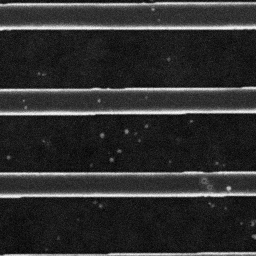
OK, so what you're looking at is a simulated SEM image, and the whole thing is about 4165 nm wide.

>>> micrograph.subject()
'lines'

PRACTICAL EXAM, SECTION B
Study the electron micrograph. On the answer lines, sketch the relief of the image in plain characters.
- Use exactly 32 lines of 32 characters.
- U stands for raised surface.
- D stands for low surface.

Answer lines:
DUUUUUUUUUUUUUUUUUUUUUUUUUUUUUUU
UUUUUUUUUUUUUUUUUUUUUUUUUUUUUUUU
UUUUUUUUUUUUUUUUUUUUUUUUUUUUUUUU
UUUUUUUUUUUUUUUUUUUUUUUUUUUUUDDD
DDDDDDDDDDDDDDDDDDDDDDDDDDDDDDDD
DDDDDDDDDDDDDDDDDDDDDDDDDDDDDDDD
DDDDDDDDDDDDDDDDDDDDDDDDDDDDDDDD
DDDDDDDDDDDDDDDDDDDDDDDDDDDDDDDD
DDDDDDDDDDDDDDDDDDDDDDDDDDDDDDDD
DDDDDDDDDDDDDDDDDDDDDDDDDDDDDDDD
DDDDDDDDDDDDDDDDDDDDDDDDDDDDDDDD
UUUUUUUUUUUUUUUUUUUUUUUUUUUUUUUU
UUUUUUUUUUUUUUUUUUUUUUUUUUUUUUUU
UUUUUUUUUUUUUUUUUUUUUUUUUUUUUUUU
DDDDDDDDDDDDDDDDDDDDDDDDDDDDDDDD
DDDDDDDDDDDDDDDDDDDDDDDDDDDDDDDD
DDDDDDDDDDDDDDDDDDDDDDDDDDDDDDDD
DDDDDDDDDDDDDDDDDDDDDDDDDDDDDDDD
DDDDDDDDDDDDDDDDDDDDDDDDDDDDDDDD
DDDDDDDDDDDDDDDDDDDDDDDDDDDDDDDD
DDDDDDDDDDDDDDDDDDDDDDDDDDDDDDDD
DDDDDDDDDDDDDDDDDDDDDDDDDDDDDDDD
UUUUUUUUUUUUUUUUUUUUUUUUUUUUUUUU
UUUUUUUUUUUUUUUUUUUUUUUUUUUUUUUU
UUUUUUUUUUUUUUUUUUUUUUUUDDDDDDDD
DDDDDDDDDDDDDDDDDDDDDDDDDDDDDDDD
DDDDDDDDDDDDDDDDDDDDDDDDDDDDDDDD
DDDDDDDDDDDDDDDDDDDDDDDDDDDDDDDD
DDDDDDDDDDDDDDDDDDDDDDDDDDDDDDDD
DDDDDDDDDDDDDDDDDDDDDDDDDDDDDDDD
DDDDDDDDDDDDDDDDDDDDDDDDDDDDDDDD
DDDDDDDDDDDDDDDDDDDDDDDDDDDDDDDD